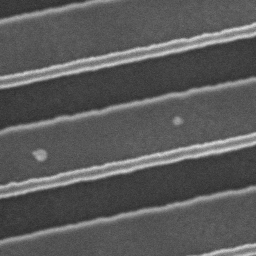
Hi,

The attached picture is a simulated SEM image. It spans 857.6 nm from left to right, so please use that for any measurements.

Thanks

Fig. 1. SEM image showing lines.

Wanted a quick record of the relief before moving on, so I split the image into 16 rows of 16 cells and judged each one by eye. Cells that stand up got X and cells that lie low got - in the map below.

----XXXXXXXXXXXX
XXXXXXXXXXXXXXXX
XXXXXXXXXXXXXX--
XXXXXXXXXX------
XXXXX-----------
-------------XXX
--------XXXXXXXX
---XXXXXXXXXXXXX
XXXXXXXXXXXXXXXX
XXXXXXXXXXXXXX--
XXXXXXXXX-------
XXXX------------
------------XXXX
-------XXXXXXXXX
---XXXXXXXXXXXXX
XXXXXXXXXXXXXXXX